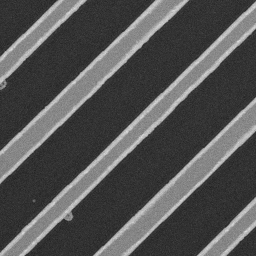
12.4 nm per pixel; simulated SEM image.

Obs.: lines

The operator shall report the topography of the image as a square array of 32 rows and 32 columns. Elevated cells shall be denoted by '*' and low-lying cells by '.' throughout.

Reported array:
.......***.........****.........
......***.........****.........*
.....***.........****.........**
....***.........****.........***
...***.........****.........***.
..***.........****.........***..
.***.........****.........***...
***.........****.........***....
**.........****........****.....
*.........****........****......
.........****.........***.......
........****........****........
.......****........****.........
......****........****.........*
.....****........****.........**
....****........****.........***
...****........****.........****
.*****........****.........****.
*****........****.........****..
****........****........*****...
***........****........*****....
**........****........*****.....
.........****........*****......
........****........*****.......
.......****........*****........
......****........*****........*
.....****........*****........**
....****........*****........***
...****........****.........****
..****........****.........****.
.***.........****.........****..
***.........****.........****...